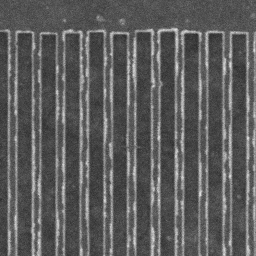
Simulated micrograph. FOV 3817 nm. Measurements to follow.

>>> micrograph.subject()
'parallel lines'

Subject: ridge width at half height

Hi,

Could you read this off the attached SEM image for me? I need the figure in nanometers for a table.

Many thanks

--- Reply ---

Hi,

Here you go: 129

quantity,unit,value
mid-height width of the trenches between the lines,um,0.233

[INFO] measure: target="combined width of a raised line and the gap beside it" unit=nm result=355